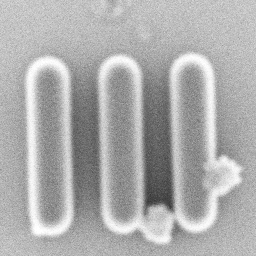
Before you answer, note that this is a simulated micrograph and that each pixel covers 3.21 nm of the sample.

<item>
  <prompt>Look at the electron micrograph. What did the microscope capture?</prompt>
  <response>groups of lines, slits or small figures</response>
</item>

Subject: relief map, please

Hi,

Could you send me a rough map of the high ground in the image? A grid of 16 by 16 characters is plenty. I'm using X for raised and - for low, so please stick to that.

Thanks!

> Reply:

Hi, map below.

----------------
----------------
----------------
----------------
--XX--XXX--XX---
--XX--XXX--XX---
--XX--XXX--XX---
--XX--XXX--XX---
--XX--XXX--XX---
--XX--XXX--XX---
--XX--XXX--XXXX-
--XX--XXX--XXXX-
--XX--XXX--XXX--
--XX---XXXXXX---
--XX-----XX-----
----------------